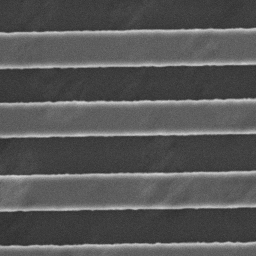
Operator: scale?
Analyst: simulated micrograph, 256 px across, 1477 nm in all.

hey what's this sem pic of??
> lines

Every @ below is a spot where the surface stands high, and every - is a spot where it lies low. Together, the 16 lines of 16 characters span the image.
----------------
----------------
@@@@@@@@@@@@@@@@
@@@@@@@@@@@@@@@@
----------------
----------------
@@@@@@@@@@@@@@@@
@@@@@@@@@@@@@@@@
@@@@@@----------
----------------
----------------
@@@@@@@@@@@@@@@@
@@@@@@@@@@@@@@@@
----------------
----------------
@@@@@@@@@@@@@@@@